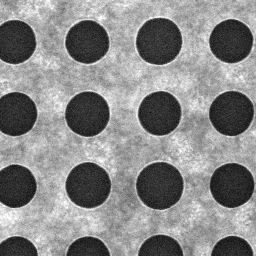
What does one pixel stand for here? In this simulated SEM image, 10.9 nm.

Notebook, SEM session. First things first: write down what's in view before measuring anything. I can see a regular array of holes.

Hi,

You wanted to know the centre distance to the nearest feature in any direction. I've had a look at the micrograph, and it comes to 786 nanometers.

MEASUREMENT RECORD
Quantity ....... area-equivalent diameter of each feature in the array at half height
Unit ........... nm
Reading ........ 498